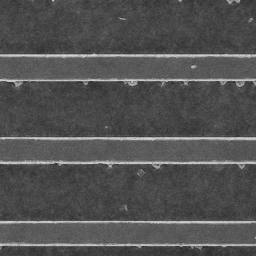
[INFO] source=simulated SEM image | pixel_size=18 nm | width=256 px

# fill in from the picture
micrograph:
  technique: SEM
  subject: lines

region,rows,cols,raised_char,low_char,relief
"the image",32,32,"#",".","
................................
................................
................................
................................
................................
................................
................................
################################
################################
################################
................................
................................
................................
................................
................................
................................
................................
################################
################################
################################
................................
................................
................................
................................
................................
................................
................................
................................
################################
################################
################################
................................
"